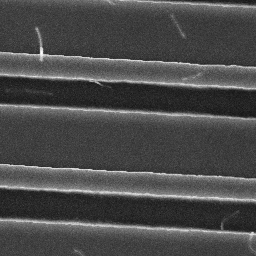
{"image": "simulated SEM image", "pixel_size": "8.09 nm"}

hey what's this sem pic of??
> lines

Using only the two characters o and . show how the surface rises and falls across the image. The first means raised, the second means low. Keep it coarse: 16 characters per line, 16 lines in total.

oooooooooooooooo
oooooooooooooooo
oooooooooooooooo
oooooooooooooooo
oooooooooooooooo
...............o
................
oooooooooooooooo
oooooooooooooooo
oooooooooooooooo
oooooooooooooooo
oooooooooooooooo
................
................
ooooooooooooo...
oooooooooooooooo